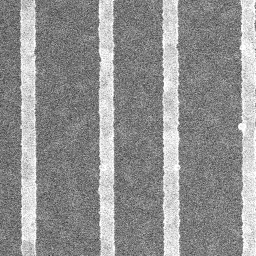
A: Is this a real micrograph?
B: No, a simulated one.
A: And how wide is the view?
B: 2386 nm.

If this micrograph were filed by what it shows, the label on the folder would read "one or a few lines or trenches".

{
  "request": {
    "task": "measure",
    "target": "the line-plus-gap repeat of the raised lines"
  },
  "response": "72.2 pixels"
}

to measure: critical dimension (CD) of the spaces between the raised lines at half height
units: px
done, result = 64.1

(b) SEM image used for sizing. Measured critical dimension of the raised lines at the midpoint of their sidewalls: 125 nanometers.